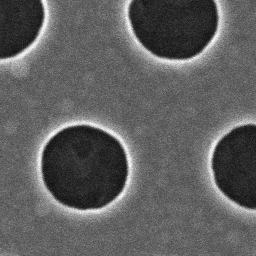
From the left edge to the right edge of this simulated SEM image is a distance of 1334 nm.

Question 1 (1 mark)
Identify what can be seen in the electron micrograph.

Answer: holes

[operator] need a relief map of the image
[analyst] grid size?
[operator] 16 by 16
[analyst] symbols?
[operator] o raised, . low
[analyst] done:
...ooooo......oo
...ooooo......oo
..ooooooo....ooo
.ooooooooo..oooo
oooooooooooooooo
oooooooooooooooo
oooooooooooooooo
oooooooooooooooo
ooo....ooooooo..
ooo.....ooooo...
ooo.....ooooo...
ooo.....oooooo..
oooo...ooooooo..
oooooooooooooooo
oooooooooooooooo
oooooooooooooooo